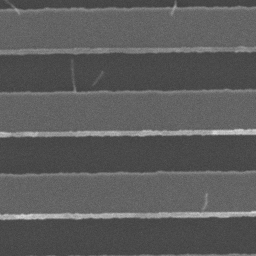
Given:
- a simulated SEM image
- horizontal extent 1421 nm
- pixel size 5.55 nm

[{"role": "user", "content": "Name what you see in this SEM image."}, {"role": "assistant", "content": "lines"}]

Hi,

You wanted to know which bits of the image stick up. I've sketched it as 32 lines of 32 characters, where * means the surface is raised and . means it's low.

................................
********************************
********************************
********************************
********************************
********************************
***************************..*.*
................................
................................
................................
................................
...*..**************************
********************************
********************************
********************************
********************************
********************************
................................
................................
................................
................................
....................*....*******
********************************
********************************
********************************
********************************
********************************
................................
................................
................................
................................
................................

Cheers